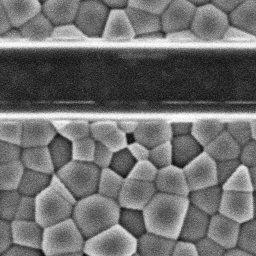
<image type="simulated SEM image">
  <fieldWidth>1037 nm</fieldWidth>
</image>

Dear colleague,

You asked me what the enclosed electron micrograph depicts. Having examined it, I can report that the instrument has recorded one or a few lines or trenches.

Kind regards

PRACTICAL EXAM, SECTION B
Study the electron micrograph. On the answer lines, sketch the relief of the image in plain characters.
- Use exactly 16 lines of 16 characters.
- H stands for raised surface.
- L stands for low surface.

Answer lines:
HHHHHHHHHHHHHHHH
HHHHHHHHHHHHHHHH
HHHHHHHHHHHHHHHH
LLLLLLLLLLLLLLLL
LLLLLLLLLLLLLLLL
LLLLLLLLLLLLLLLL
LLLLLLLLLLLLLLLL
HHHHHHHHHHHHHHHH
HHHHHHHHHHHHHHHH
HHHHHHHHHHHHHHHH
HHHHHHHHHHHHHHHH
HHHHHHHHHHHHHHHH
HHHHHHHHHHHHHHHH
HHHHHHHHHHHHHHHH
HHHHHHHHHHHHHHHH
HHHHHHHHHHHHHHHH